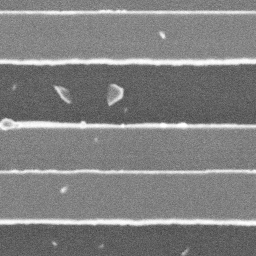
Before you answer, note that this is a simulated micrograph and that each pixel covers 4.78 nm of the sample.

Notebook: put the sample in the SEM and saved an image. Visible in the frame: lines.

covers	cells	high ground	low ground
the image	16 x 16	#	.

################
################
################
################
................
................
................
................
################
################
################
################
################
################
................
................